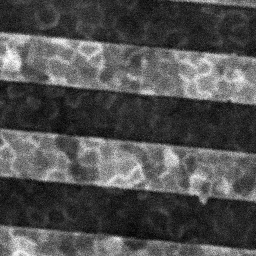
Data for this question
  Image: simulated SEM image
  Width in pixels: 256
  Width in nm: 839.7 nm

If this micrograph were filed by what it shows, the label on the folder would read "one or a few lines or trenches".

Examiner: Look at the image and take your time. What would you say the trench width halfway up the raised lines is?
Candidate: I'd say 0.163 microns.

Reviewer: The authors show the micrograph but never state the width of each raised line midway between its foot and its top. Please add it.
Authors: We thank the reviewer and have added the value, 151 nm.